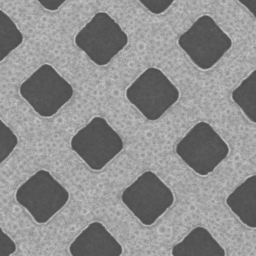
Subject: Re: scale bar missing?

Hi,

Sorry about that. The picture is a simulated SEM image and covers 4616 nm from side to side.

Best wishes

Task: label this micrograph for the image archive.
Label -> a regular array of holes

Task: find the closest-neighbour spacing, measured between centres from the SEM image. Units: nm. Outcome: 1320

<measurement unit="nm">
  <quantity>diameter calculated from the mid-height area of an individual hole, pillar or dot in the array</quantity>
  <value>852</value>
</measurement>